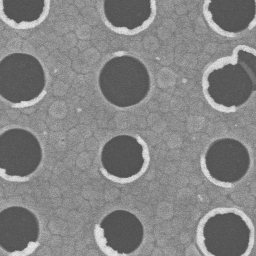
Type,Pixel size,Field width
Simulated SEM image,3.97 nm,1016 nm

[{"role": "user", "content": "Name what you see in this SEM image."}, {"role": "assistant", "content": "holes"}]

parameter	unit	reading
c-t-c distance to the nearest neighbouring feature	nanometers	298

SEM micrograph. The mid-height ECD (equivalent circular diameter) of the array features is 0.172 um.